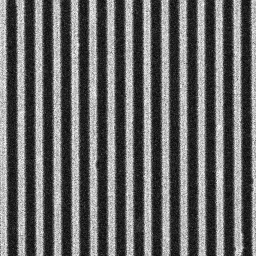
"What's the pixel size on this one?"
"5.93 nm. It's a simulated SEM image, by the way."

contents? parallel lines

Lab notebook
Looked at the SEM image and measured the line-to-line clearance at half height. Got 63 nanometers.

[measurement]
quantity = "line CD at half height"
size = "46 nm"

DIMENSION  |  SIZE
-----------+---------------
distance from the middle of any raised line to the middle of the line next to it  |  18 px